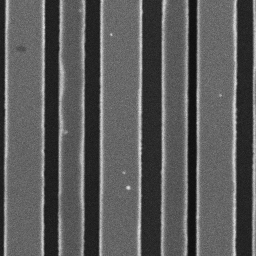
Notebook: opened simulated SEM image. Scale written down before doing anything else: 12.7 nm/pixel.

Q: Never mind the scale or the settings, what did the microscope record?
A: lines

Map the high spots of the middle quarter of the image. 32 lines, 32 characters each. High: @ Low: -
@@@@@----@@@@@@@@@@------@@@@@@-
@@@@@----@@@@@@@@@@------@@@@@@-
@@@@@----@@@@@@@@@@------@@@@@@-
@@@@@----@@@@@@@@@@------@@@@@@-
@@@@@----@@@@@@@@@@------@@@@@@-
@@@@@----@@@@@@@@@@------@@@@@@-
@@@@@----@@@@@@@@@@------@@@@@@-
@@@@@----@@@@@@@@@@------@@@@@@-
@@@@@----@@@@@@@@@@------@@@@@@-
@@@@@----@@@@@@@@@@------@@@@@@-
@@@@@----@@@@@@@@@@------@@@@@@-
@@@@@----@@@@@@@@@@------@@@@@@-
@@@@@----@@@@@@@@@@------@@@@@@-
@@@@@----@@@@@@@@@@------@@@@@@-
@@@@@----@@@@@@@@@@------@@@@@@-
@@@@@----@@@@@@@@@@------@@@@@@-
@@@@@----@@@@@@@@@@------@@@@@@-
@@@@@----@@@@@@@@@@------@@@@@@-
@@@@@----@@@@@@@@@@------@@@@@@-
@@@@@----@@@@@@@@@@------@@@@@@-
@@@@@----@@@@@@@@@@------@@@@@@-
@@@@@----@@@@@@@@@@------@@@@@@-
@@@@@----@@@@@@@@@@------@@@@@@-
@@@@@----@@@@@@@@@@------@@@@@@-
@@@@@----@@@@@@@@@@------@@@@@@-
@@@@@----@@@@@@@@@@------@@@@@@-
@@@@@----@@@@@@@@@@------@@@@@@-
@@@@@----@@@@@@@@@@-----@@@@@@@-
@@@@@----@@@@@@@@@@------@@@@@@-
@@@@@----@@@@@@@@@@------@@@@@@-
@@@@@----@@@@@@@@@@------@@@@@@-
@@@@@----@@@@@@@@@@------@@@@@@-